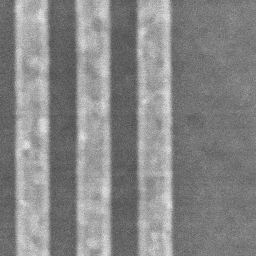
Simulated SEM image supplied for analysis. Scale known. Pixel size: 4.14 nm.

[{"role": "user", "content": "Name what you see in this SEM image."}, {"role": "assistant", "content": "one or a few lines or trenches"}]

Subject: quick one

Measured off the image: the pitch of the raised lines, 253 nm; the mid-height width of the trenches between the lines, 0.142 micrometres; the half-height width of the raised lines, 109 nanometres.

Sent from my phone